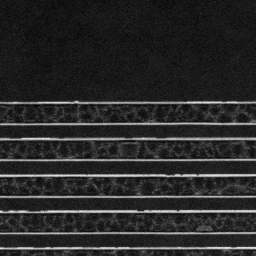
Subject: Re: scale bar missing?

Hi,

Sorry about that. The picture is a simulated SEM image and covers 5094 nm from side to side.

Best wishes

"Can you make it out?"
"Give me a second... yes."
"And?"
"parallel lines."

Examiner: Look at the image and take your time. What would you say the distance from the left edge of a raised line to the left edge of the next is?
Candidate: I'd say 36.4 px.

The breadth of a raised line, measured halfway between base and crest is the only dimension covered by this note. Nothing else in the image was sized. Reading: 0.303 micrometres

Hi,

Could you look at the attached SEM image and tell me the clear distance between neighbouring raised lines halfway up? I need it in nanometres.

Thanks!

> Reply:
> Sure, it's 410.